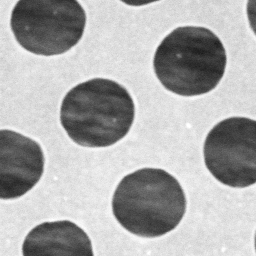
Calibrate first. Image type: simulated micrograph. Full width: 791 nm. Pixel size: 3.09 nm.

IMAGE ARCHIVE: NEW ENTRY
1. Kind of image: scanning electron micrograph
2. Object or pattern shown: holes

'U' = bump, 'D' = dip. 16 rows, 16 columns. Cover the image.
UDDDDUUUUUUUUUUD
UDDDDUUUUUUUUUUU
UDDDDUUUUUDDDDUU
UUUUUUUUUUDDDDUU
UUUUUUUUUUDDDDUU
UUUUUDDDUUDDDUUU
UUUUDDDDUUUUUUUU
UUUUDDDDUUUUUUDD
DDUUDDDDUUUUUDDD
DDDUUUUUUUUUUDDD
DDDUUUUUUUUUUDDD
DDUUUUUDDDDUUUDD
UUUUUUUDDDDDUUUU
UUUUUUUDDDDUUUUU
UUDDDUUUDDDUUUUU
UDDDDDUUUUUUUUUU